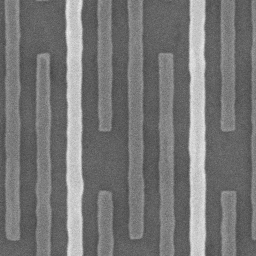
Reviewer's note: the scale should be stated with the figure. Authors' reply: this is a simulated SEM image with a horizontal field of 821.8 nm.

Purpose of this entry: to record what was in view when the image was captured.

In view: wiring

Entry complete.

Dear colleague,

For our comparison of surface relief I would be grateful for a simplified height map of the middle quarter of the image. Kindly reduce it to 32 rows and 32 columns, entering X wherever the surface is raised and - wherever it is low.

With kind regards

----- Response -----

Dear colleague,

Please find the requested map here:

-XXX-----XXX----XXX-----XXX-----
-XXX-----XXX----XXX-----XXX-----
-XXX-----XXX----XXX-----XXX-----
-XXX-----XXX----XXX-----XXX-----
-XXX-----XXX----XXXX----XXX-----
-XXX-----XXX----XXXX----XXX-----
-XXX-----XXX----XXX-----XXX-----
-XXX-----XXX----XXX-----XXX-----
-XXX-----XXX----XXX-----XXX-----
-XXX-----XXX----XXX-----XXX-----
-XXX-----XXX----XXX-----XXX-----
-XXX-----XXX----XXXX----XXX-----
-XXX-----XXX----XXXX----XXX-----
-XXX-----XXX----XXXX----XXX-----
-XXX-----XXX----XXXX----XXX-----
-XXX-----XXX----XXXX----XXX-----
-XXX-----XX-----XXX-----XXX-----
-XXX------------XXX-----XXX-----
-XXX------------XXXX----XXX-----
-XXX------------XXXX----XXX-----
-XXX------------XXXX----XXX-----
-XXX------------XXXX----XXX-----
-XXX------------XXXX----XXX-----
-XXX-------------XXX----XXX-----
-XXX-------------XX-----XXX-----
-XXX------------XXX-----XXX-----
-XXX------------XXX-----XXX-----
-XXX------------XXXX----XXX-----
-XXXX-----------XXXX----XXX-----
-XXXX-----------XXXX----XXX-----
-XXXX-----------XXXX----XXX-----
-XXXX-----------XXXX----XXX-----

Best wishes